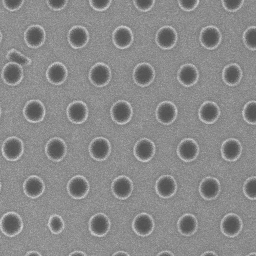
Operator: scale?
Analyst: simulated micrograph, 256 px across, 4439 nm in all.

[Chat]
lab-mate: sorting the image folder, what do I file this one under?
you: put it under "a regular array of raised bodies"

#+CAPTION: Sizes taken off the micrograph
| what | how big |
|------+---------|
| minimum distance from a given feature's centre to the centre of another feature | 42.7 px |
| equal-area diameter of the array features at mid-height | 381 nanometres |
